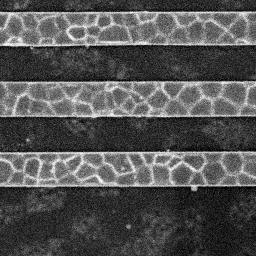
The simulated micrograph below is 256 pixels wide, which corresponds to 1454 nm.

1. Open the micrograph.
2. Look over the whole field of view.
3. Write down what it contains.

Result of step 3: one or a few lines or trenches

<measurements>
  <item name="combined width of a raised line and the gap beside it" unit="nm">399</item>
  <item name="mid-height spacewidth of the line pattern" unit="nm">206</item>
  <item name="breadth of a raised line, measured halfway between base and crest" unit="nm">191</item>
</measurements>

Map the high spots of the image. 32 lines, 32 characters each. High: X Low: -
--------------------------------
--------------------------------
XXXXXXXXXXXXXXXXXXXXXXXXXXXXXXXX
XXXXXXXXXXXXXXXXXXXXXXXXXXXXXXXX
XXXXXXXXXXXXXXXXXXXXXXXXXXXXXXXX
XXXXXXXXXXXXXXXXXXXXXXXXXXXXXX--
--------------------------------
--------------------------------
--------------------------------
--------------------------------
XXXXXXXXXXXXXXXXXXXXXXXXXXXXXXXX
XXXXXXXXXXXXXXXXXXXXXXXXXXXXXXXX
XXXXXXXXXXXXXXXXXXXXXXXXXXXXXXXX
XXXXXXXXXXXXXXXXXXXXXXXXXXXXXXXX
XXXX---X---X-------XXX----------
--------------------------------
--------------------------------
--------------------------------
--------------------------------
XXXXXXXXXXXXXXXXXXXXXXXXXXXXXXXX
XXXXXXXXXXXXXXXXXXXXXXXXXXXXXXXX
XXXXXXXXXXXXXXXXXXXXXXXXXXXXXXXX
XXXXXXXXXXXXXXXXXXXXXXXXXXXXXXXX
--------------------------------
--------------------------------
--------------------------------
--------------------------------
--------------------------------
--------------------------------
--------------------------------
--------------------------------
--------------------------------